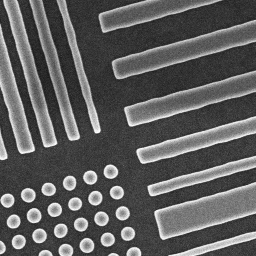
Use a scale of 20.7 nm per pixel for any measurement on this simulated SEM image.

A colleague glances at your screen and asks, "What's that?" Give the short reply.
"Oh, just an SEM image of groups of lines, slits or small figures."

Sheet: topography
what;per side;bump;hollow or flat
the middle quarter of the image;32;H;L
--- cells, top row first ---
LLLHHLLLLLLLHHHHHHHHHHHHHHLLLLLL
LLLHHLLLLLLLHHHHHHHHHHHLLLLLLLLL
LLLLHLLLLLLLLHHHHHHLLLLLLLLLLLLL
LLLLHHLLLLLLLHHLLLLLLLLLLLLLLLLL
LLLLHHLLLLLLLLLLLLLLLLLLLLLLLLLL
LLLLHHLLLLLLLLLLLLLLLLLLLLLLLLLL
HLLLHHLLLLLLLLLLLLLLLLLLLLLLLLLH
HLLLLHHLLLLLLLLLLLLLLLLLLLLHHHHH
HLLLLHHLLLLLLLLLLLLLLLLLHHHHHHHH
HLLLLHHLLLLLLLLLLLLLHHHHHHHHHHHH
HHLLLLHLLLLLLLLLLHHHHHHHHHHHHHHH
HHLLLLHHLLLLLLLHHHHHHHHHHHHHHHHH
HHLLLLHHLLLLLLLHHHHHHHHHHHHHLLLL
HHHLLLHHLLLLLLLLHHHHHHHHHLLLLLLL
HHHLLLLHHLLLLLLLHHHHHLLLLLLLLLLL
HHHLLLLHHLLLLLLLLLLLLLLLLLLLLLLL
HHHLLLLHHLLLLLLLLLLLLLLLLLLLLLLL
LHHHLLLLLLLLLLLLLLLLLLLLLLLLLLLL
LHHHLLLLLLLLLLLLLLLLLLLLLLLLLHHH
LLLLLLLLLLLLLLLLLLLLLLLLLHHHHHHH
LLLLLLLLLLLLLLLLLLLLLLHHHHHHHHHH
LLLLLLLLLLLLLLLLLLHHHHHHHHHHHHHH
LLLLLLLLLLLLLLLLLLHHHHHHHHHHHLLL
LLLLLLLLLLLLLLLLLLLHHHHHHHLLLLLL
LLLLLLLLLLLLLLLLLLLHHLLLLLLLLLLL
LLLLLLLLLLLHHLLLLLLLLLLLLLLLLLLL
LLLLLLLLLLHHHLLLLLLLLLLLLLLLLLLL
LLLLLHHHLLHHHLLLLLLLLLLLLLLLLLLH
HHHLLHHHLLLLLLLLLLLLLLLLLLLHHHHH
HHHLLHHHLLLLLLLLLLLLLLLLHHHHHHHH
HHHLLLLLLLLLLLLLLLLLLHHHHHHHHHHL
LHLLLLLLLLLLHHHLLLLLLHHHHHHLLLLL